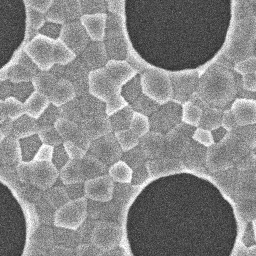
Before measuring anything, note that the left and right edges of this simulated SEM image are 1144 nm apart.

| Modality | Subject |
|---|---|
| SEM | holes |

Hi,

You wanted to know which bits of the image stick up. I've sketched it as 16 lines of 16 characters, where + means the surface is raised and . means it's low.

..++++++......++
..++++++......++
.+++++++......++
.++++++++....+++
++++++++++++++++
++++++++++++++++
++++++++++++++++
++++++++++++++++
++++++++++++++++
++++++++++++++++
++++++++++++++++
+++++++++....+++
.+++++++......++
.+++++++.......+
..++++++.......+
..++++++.......+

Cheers